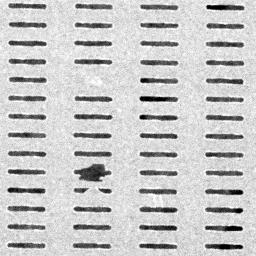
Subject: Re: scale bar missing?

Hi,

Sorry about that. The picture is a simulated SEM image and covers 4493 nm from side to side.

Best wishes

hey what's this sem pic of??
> a regular array of holes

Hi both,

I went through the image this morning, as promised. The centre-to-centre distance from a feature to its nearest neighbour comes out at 0.32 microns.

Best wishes